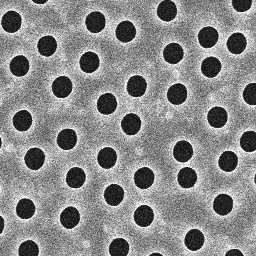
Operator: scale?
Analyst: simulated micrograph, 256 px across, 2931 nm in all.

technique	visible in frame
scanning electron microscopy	a regular array of holes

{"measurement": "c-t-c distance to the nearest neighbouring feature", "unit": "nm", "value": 420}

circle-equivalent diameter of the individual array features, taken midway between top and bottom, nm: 242